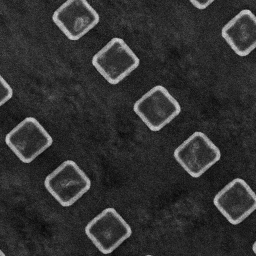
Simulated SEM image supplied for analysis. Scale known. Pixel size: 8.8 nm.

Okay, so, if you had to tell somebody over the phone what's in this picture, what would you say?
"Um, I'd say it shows raised bodies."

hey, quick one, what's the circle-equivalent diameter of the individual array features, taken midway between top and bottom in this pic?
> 0.333 um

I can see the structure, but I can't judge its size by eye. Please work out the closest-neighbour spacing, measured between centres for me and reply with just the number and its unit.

538 nanometres